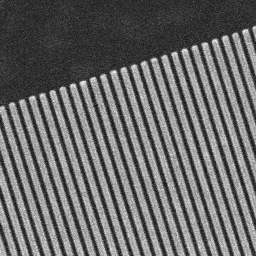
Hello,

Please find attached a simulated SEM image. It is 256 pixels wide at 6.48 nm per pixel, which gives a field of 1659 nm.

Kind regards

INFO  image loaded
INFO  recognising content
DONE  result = parallel lines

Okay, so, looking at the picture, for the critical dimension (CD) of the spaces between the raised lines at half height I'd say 35.6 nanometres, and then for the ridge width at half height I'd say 35.6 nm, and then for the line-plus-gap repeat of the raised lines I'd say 0.0689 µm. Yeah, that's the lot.